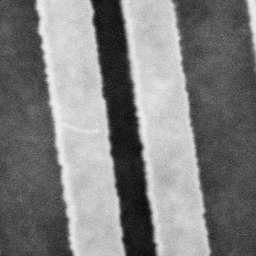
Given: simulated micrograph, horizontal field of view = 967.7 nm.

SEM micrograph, lines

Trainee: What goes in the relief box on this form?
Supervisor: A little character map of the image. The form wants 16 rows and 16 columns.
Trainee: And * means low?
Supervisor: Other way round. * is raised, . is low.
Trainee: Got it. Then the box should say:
..****..***.....
..****..***.....
...***..***.....
...***..***.....
...***..***.....
...***..****....
...****.****....
...****..***....
...****..***....
....***..***....
....***..***....
....***..***....
....***..****...
....***..****...
....****..***...
....****..***...